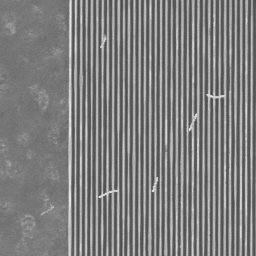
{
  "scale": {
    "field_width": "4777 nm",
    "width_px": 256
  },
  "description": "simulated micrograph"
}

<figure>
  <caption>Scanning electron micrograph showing parallel lines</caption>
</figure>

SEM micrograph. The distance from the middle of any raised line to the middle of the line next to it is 0.0995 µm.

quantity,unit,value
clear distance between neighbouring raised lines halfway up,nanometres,56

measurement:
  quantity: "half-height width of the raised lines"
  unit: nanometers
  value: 37.3